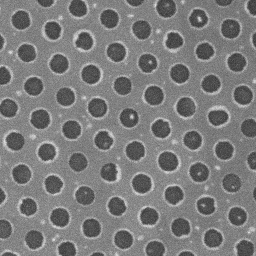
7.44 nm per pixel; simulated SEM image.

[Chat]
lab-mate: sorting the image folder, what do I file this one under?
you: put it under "a regular array of holes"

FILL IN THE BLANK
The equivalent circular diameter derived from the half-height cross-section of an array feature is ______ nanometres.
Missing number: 144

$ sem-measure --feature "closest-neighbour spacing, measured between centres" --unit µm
0.246